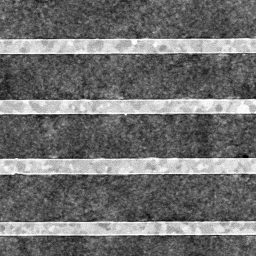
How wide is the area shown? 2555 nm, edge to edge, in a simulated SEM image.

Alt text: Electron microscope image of one or a few lines or trenches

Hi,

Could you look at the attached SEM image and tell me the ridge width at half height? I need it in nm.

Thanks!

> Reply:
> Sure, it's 136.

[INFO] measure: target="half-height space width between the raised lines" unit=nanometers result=466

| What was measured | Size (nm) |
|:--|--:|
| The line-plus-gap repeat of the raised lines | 607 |